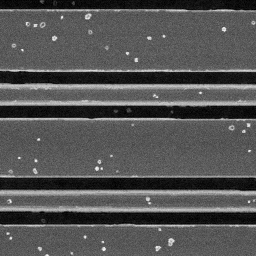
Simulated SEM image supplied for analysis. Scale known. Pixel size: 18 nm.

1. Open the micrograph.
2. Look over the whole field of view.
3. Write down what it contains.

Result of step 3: lines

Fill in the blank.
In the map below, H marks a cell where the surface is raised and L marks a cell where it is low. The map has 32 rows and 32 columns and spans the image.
LLLLLLLLLLLLLLLLLLLLLLLLLLLLLLLL
HHHHHHHHHHHHHHHHHHHHHHHHHHHHHHHH
HHHHHHHHHHHHHHHHHHHHHHHHHHHHHHHH
HHHHHHHHHHHHHHHHHHHHHHHHHHHHHHHH
HHHHHHHHHHHHHHHHHHHHHHHHHHHHHHHH
HHHHHHHHHHHHHHHHHHHHHHHHHHHHHHHH
HHHHHHHHHHHHHHHHHHHHHHHHHHHHHHHH
HHHHHHHHHHHHHHHHHHHHHHHHHHHHHHHH
HHHHHHHHHHHHHHHHHHHHHHHHHHHHHHHH
LLLLLLLLLLLLLLLLLLLLLLLLLLLLLLLL
LLLLLLLLLLLLLLLLLLLLLLLLLLLLLLLL
HHHHHHHHHHHHHHHHHHHHHHHHHHHHHHHH
HHHHHHHHHHHHHHHHHHHHHHHHHHHHHHHH
LLLLLLLLLLLLLLLLLLLLLLLLLLLLLLLL
LLLLLLLLLLLLLLLLLLLLLLLLLLLLLLLL
HHHHHHHHHHHHHHHHHHHHHHHHHHHHHHHH
HHHHHHHHHHHHHHHHHHHHHHHHHHHHHHHH
HHHHHHHHHHHHHHHHHHHHHHHHHHHHHHHH
HHHHHHHHHHHHHHHHHHHHHHHHHHHHHHHH
HHHHHHHHHHHHHHHHHHHHHHHHHHHHHHHH
HHHHHHHHHHHHHHHHHHHHHHHHHHHHHHHH
HHHHHHHHHHHHHHHHHHHHHHHHHHHHHHHH
LLLLLLLLLLLLLLLLLLLLLLLLLLLLLLLL
LLLLLLLLLLLLLLLLLLLLLLLLLLLLLLLL
HHHHHHHHHHHHHHHHHHHHHHHHHHHHHHHH
HHHHHHHHHHHHHHHHHHHHHHHHHHHHHHHH
LLLLLLLLLLLLLLLLLLLLLLLLLLLLLLLL
LLLLLLLLLLLLLLLLLLLLLLLLLLLLLLLL
HHHHHHHHHHHHHHHHHHHHHHHHHHHHHHHH
HHHHHHHHHHHHHHHHHHHHHHHHHHHHHHHH
HHHHHHHHHHHHHHHHHHHHHHHHHHHHHHHH
HHHHHHHHHHHHHHHHHHHHHHHHHHHHHHHH